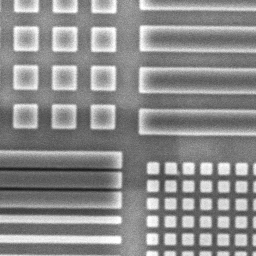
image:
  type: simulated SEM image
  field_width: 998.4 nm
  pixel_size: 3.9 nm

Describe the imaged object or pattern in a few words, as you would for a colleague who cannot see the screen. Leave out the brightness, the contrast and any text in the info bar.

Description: groups of lines, slits or small figures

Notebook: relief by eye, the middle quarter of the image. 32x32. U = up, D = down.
DDDDDDDDDDDDDDDDDDDDDDDDDDDDDDDD
UUUDDDDUUUUUUDDDDDDUUUUUUUUUUUUU
UUUDDDDUUUUUUDDDDDDUUUUUUUUUUUUU
UUUDDDDUUUUUUDDDDDDUUUUUUUUUUUUU
UUUDDDDUUUUUUDDDDDDUUUUUUUUUUUUU
UUUDDDDUUUUUUDDDDDDUUUUUUUUUUUUU
DDDDDDDDDDDDDDDDDDDUUUUUUUUUUUUU
DDDDDDDDDDDDDDDDDDDDDDDDDDDDDDDD
DDDDDDDDDDDDDDDDDDDDDDDDDDDDDDDD
DDDDDDDDDDDDDDDDDDDDDDDDDDDDDDDD
UUDDDDDDDDDDDDDDDDDDDDDDDDDDDDDD
UUUDDDDUUUUUDDDDDDDUUUUUDDDDDDDD
UUUDDDDUUUUUDDDDDDDUUUUUUUUUUUUU
UUUDDDDUUUUUDDDDDDDUUUUUUUUUUUUU
UUUDDDDUUUUUDDDDDDDUUUUUUUUUUUUU
UUUDDDDUUUUUDDDDDDDUUUUUUUUUUUUU
DDDDDDDDDDDDDDDDDDDUUUUUUUUUUUUU
DDDDDDDDDDDDDDDDDDDDDDDDDDUUUUUU
DDDDDDDDDDDDDDDDDDDDDDDDDDDDDDDD
DDDDDDDDDDDDDDDDDDDDDDDDDDDDDDDD
DDDDDDDDDDDDDDDDDDDDDDDDDDDDDDDD
DDDDDDDDDDDDDDDDDDDDDDDDDDDDDDDD
UUUUUUUUUUUUUUDDDDDDDDDDDDDDDDDD
UUUUUUUUUUUUUUDDDDDDDDDDDDDDDDDD
UUUUUUUUUUUUUUDDDDDDDDDDDDDDDDDD
UUUUUUUUUUUUUUDDDDDDDUUUDUUUDDUU
DDDDDDDDDDDDDDDDDDDDDUUUDUUUDDUU
UUUUUUUUUUUUUUDDDDDDDDDDDDDDDDDD
UUUUUUUUUUUUUUDDDDDDDDDDDDDDDDDD
UUUUUUUUUUUUUUDDDDDDDUUDDUUUDDUU
UUUUUUUUUUUUUUDDDDDDDUUDDUUUDDUU
DDDDDDDDDDDDDDDDDDDDDUUDDUUUDDUU